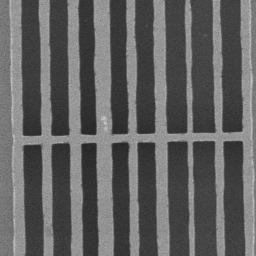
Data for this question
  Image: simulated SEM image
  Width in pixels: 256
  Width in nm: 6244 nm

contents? groups of lines, slits or small figures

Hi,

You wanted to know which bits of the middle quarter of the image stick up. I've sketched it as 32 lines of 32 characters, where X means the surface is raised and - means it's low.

-XXX----XXXX----XX-----XX------X
-XXX----XXXX----XX-----XX------X
-XXX----XXXX----XX-----XX------X
-XXX----XXXX----XX-----XX------X
-XXX----XXXX----XX-----XX------X
-XXX----XXXX----XX-----XX------X
-XXX----XXXX----XX-----XX------X
-XXX----XXXX----XX-----XX------X
-XXX----XXXX----XX-----XX------X
-XXX----XXXX----XX-----XX------X
-XXX----XXXX----XX-----XX------X
-XXX----XXXX----XX-----XX------X
-XXX----XXXX----XX-----XX------X
-XXX----XXXX----XX-----XX------X
-XXX----XXXX----XX-----XX------X
-XXX----XXXX----XX-----XX------X
--XX----XXXX----XX-----XX------X
--XX----XXXX----XXX---XXXX----XX
XXXXXXXXXXXXXXXXXXXXXXXXXXXXXXXX
XXXXXXXXXXXXXX--XXX---XXXX-----X
--XX----XXXX----XX-----XXX-----X
--XX----XXXX----XX-----XXX-----X
--XX----XXXX----XX-----XXX-----X
--XX----XXXX----XX-----XXX-----X
--XX----XXXX----XX-----XXX-----X
--XX----XXXX----XX-----XXX-----X
--XX----XXXX----XX-----XXX-----X
--XX----XXXX----XX-----XXX-----X
--XX----XXXX----XX-----XXX-----X
--XX-----XXX----XX-----XXX-----X
--XX-----XXX----XX-----XXX-----X
--XXX----XXX----XX-----XXX-----X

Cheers